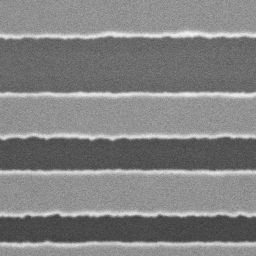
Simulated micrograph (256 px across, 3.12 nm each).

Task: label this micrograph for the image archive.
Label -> lines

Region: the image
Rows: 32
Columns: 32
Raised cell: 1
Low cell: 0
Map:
11111111111111111111111111111111
11111111111111111111111111111111
11111111111111111111111111111111
11111111111111111111111111111111
11111111111110011111111001111111
00000000000000000000000000000000
00000000000000000000000000000000
00000000000000000000000000000000
00000000000000000000000000000000
00000000000000000000000000000000
00000000000000000000000000000000
00000000000000000000000000000000
11111111111111111111111111111111
11111111111111111111111111111111
11111111111111111111111111111111
11111111111111111111111111111111
11111111111111111111111111111111
00000000000000000000000000000000
00000000000000000000000000000000
00000000000000000000000000000000
00000000000000000000000000000000
11111111111111111111111111111111
11111111111111111111111111111111
11111111111111111111111111111111
11111111111111111111111111111111
11111111111111111111111111111111
11111111111111111111111111111111
00000000000000000000000000000000
00000000000000000000000000000000
00000000000000000000000000000000
11111111011111111111111111111111
11111111111111111111111111111111